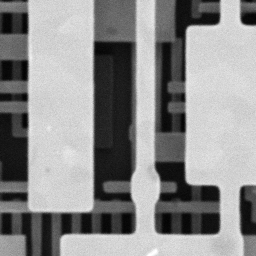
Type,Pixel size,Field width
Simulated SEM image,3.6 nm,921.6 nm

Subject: wiring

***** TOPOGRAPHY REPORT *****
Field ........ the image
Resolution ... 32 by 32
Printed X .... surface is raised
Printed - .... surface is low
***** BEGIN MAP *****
----XXXXXXXX-----XX---------XX--
----XXXXXXXX-----XX---------XX--
----XXXXXXXX-----XX---------XX--
----XXXXXXXX-----XX-----XXXXXXXX
----XXXXXXXX-----XX----XXXXXXXXX
----XXXXXXXX-----XX----XXXXXXXXX
----XXXXXXXX-----XX----XXXXXXXXX
----XXXXXXXX-----XX----XXXXXXXXX
----XXXXXXXX-----XX----XXXXXXXXX
----XXXXXXXX-----XX----XXXXXXXXX
----XXXXXXXX-----XX----XXXXXXXXX
----XXXXXXXX-----XX----XXXXXXXXX
----XXXXXXXX-----XX----XXXXXXXXX
----XXXXXXXX-----XX----XXXXXXXXX
----XXXXXXXX-----XX----XXXXXXXXX
----XXXXXXXX-----XX----XXXXXXXXX
----XXXXXXXX-----XX----XXXXXXXXX
----XXXXXXXX-----XX----XXXXXXXXX
----XXXXXXXX-----XX----XXXXXXXXX
----XXXXXXXX-----XX----XXXXXXXXX
----XXXXXXXX-----XX----XXXXXXXXX
----XXXXXXXX-----XXX---XXXXXXXXX
----XXXXXXXX----XXXX---XXXXXXXXX
----XXXXXXXX----XXXX-------XXX--
----XXXXXXXX----XXXX--------XX--
----XXXXXXXX-----XX---------XX--
-----------------XX---------XX--
-----------------XX---------XX--
-----------------XX--------XXX--
--------XXXXXXXXXXXXXXXXXXXXXX--
--------XXXXXXXXXXXXXXXXXXXXXX--
--------XXXXXXXXXXXXXXXXXXXXXX--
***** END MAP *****